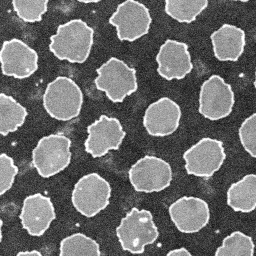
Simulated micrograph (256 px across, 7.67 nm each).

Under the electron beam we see a regular array of raised bodies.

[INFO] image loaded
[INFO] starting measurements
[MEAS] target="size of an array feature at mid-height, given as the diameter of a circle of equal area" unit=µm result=0.29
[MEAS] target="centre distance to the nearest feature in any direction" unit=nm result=435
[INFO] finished